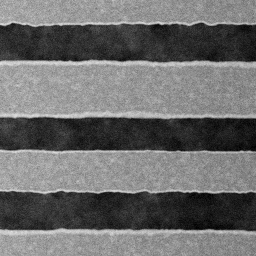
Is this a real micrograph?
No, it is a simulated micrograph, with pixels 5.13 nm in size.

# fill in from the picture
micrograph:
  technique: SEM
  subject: lines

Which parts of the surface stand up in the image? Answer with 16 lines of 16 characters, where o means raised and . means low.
oooooooooooooooo
oooooooooooo.ooo
................
................
oooooooooooooooo
oooooooooooooooo
oooooooooooooooo
................
................
oooooooooooooo.o
oooooooooooooooo
oooooooooooooooo
................
................
oooooooooooooooo
oooooooooooooooo